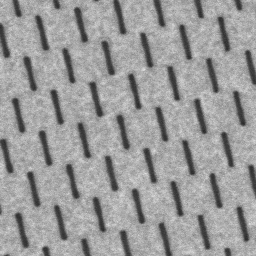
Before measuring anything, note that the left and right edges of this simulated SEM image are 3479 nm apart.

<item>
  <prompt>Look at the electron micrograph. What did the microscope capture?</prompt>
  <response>a regular array of holes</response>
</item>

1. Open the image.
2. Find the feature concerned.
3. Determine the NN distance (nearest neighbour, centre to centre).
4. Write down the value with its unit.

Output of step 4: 0.536 um